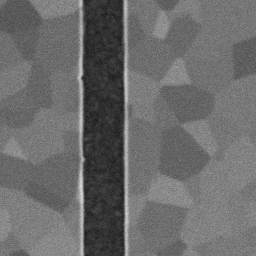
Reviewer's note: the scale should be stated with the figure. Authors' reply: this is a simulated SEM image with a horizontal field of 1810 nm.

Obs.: one or a few lines or trenches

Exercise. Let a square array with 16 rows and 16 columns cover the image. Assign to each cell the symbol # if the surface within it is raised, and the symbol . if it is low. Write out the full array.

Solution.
#####...########
#####...########
#####...########
#####...########
#####...########
#####...########
#####...########
#####...########
#####...########
#####...########
#####...########
#####...########
#####...########
#####...########
#####...########
#####...########